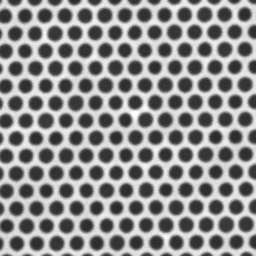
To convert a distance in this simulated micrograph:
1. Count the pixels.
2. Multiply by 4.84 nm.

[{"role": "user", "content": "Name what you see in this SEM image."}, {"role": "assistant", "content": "a regular array of holes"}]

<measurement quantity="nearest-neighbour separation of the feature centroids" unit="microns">0.0962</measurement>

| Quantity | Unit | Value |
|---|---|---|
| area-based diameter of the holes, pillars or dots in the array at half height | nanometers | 72.5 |